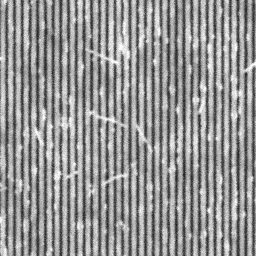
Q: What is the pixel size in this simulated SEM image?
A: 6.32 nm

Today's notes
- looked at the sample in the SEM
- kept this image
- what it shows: parallel lines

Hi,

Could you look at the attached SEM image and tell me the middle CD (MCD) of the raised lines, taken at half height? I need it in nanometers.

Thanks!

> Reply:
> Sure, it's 27.6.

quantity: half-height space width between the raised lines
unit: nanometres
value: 22.1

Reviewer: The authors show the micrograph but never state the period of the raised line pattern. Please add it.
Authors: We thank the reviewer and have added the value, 48.8 nanometres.